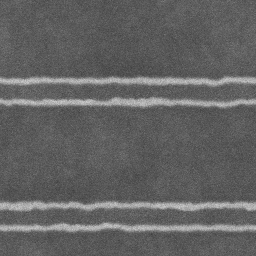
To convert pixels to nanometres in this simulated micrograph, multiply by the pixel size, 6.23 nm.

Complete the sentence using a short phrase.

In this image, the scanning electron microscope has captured one or a few lines or trenches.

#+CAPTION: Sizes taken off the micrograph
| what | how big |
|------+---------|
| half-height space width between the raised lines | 637 nanometers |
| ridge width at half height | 140 nanometres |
